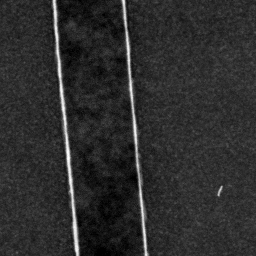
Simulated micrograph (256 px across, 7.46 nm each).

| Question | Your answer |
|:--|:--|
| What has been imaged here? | one or a few lines or trenches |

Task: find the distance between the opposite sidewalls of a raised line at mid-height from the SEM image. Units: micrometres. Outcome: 0.519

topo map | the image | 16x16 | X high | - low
---XXXXX--------
---XXXXX--------
----XXXX--------
----XXXX--------
----XXXX--------
----XXXX--------
----XXXX--------
----XXXX--------
----XXXX--------
----XXXXX-------
----XXXXX-------
----XXXXX-------
-----XXXX-------
-----XXXX-------
-----XXXX-------
-----XXXX-------